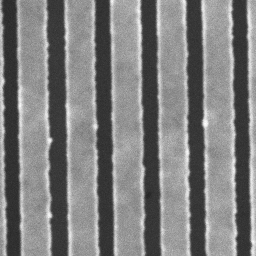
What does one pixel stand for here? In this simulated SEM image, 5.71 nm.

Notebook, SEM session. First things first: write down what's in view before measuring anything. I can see lines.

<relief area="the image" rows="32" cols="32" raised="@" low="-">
--@@@@--@@@@--@@@---@@@--@@@@--@
--@@@@--@@@@--@@@---@@@--@@@@--@
--@@@@--@@@@--@@@---@@@--@@@@--@
--@@@@--@@@@--@@@@--@@@--@@@@--@
--@@@@--@@@@--@@@@--@@@--@@@@--@
--@@@@--@@@@--@@@@--@@@--@@@@--@
--@@@@--@@@@--@@@@--@@@--@@@@--@
--@@@@--@@@@--@@@@--@@@--@@@@--@
--@@@@--@@@@--@@@@--@@@--@@@@--@
--@@@@--@@@@--@@@@--@@@---@@@--@
--@@@@--@@@@--@@@@--@@@---@@@--@
--@@@@--@@@@--@@@@--@@@---@@@--@
--@@@@--@@@@--@@@@--@@@---@@@--@
--@@@@--@@@@--@@@@--@@@---@@@--@
--@@@@--@@@@--@@@@--@@@---@@@--@
--@@@@--@@@@--@@@@--@@@--@@@@--@
--@@@@--@@@@--@@@@--@@@---@@@--@
--@@@@--@@@@--@@@@--@@@---@@@--@
--@@@@--@@@@--@@@@--@@@@--@@@--@
--@@@@--@@@@--@@@@--@@@@--@@@--@
--@@@@---@@@--@@@@--@@@@--@@@--@
--@@@@---@@@--@@@@--@@@@--@@@--@
--@@@@--@@@@--@@@@--@@@---@@@--@
@--@@@---@@@--@@@@--@@@@--@@@--@
@--@@@---@@@--@@@@--@@@@--@@@--@
@--@@@---@@@--@@@@--@@@@--@@@--@
@--@@@---@@@--@@@@--@@@@--@@@--@
@--@@@---@@@--@@@@--@@@@--@@@--@
@--@@@---@@@--@@@@--@@@@--@@@--@
@--@@@---@@@--@@@@--@@@@--@@@--@
@--@@@---@@@--@@@@--@@@@--@@@--@
@--@@@---@@@--@@@@--@@@@--@@@--@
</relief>